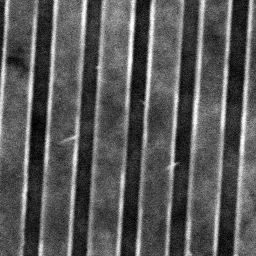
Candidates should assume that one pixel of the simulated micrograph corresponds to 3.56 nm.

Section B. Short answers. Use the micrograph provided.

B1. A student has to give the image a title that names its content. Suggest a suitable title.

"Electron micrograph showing parallel lines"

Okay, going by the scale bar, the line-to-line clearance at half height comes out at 0.0577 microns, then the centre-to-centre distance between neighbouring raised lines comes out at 173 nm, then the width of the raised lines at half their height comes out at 115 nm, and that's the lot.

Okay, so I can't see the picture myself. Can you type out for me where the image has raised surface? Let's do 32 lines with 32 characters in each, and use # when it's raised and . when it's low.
.####..####..####..####..####..#
.####..####..####..####..####..#
.####..####..####..####..####..#
.####..####..####..####..####..#
.###...####..####..####..####..#
####..####...####..####..####..#
####..####...###...####..####..#
####..####..#####..####..####..#
####..####..####..####...###...#
####..####..####..####...###...#
####..####..####..####..####...#
####..####..####..####..####..##
####..####..####..####..####..##
####..####..####..####..####..##
####..####..####..####..####..##
####..####..####..####..####..##
####..####..####..####..####..##
####..####..####..####..####..##
####..####..####..####..####..##
####..####..####..####..####..##
###...####..####..####..####..##
###..####...####..####..####..##
###..####...####..####..####..##
###..####..####...####..####..##
###..####..####..####...###...##
###..####..####..####...###...##
###..####..####..####..####...##
###..####..####..####..####...##
###..####..####..####..####...##
###..####..####..####..####..###
###..####..####..####..####..###
###..####..####..####..####..###